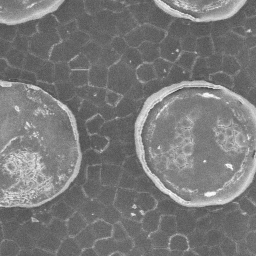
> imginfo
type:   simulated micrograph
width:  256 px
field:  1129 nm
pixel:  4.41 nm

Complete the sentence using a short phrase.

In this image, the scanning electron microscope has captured raised bodies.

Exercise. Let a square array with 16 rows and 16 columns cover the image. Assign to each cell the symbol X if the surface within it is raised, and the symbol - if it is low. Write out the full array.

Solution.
XXX-------XXXXX-
----------------
----------------
----------------
----------------
XX---------XXX--
XXXX-----XXXXXX-
XXXXX----XXXXXXX
XXXXX----XXXXXXX
XXXXX----XXXXXXX
XXXXX----XXXXXXX
XXXX------XXXXX-
XXX--------XXX--
----------------
----------------
----------------